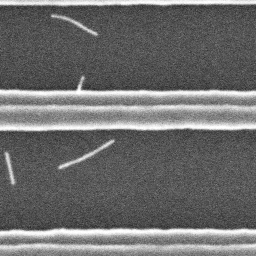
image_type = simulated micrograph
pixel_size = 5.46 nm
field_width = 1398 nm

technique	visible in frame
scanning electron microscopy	lines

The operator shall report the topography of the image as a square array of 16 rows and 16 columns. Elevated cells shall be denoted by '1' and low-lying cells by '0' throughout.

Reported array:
0000000000000000
0000000000000000
0000000000000000
0000000000000000
0000000000000000
0000000000000000
1111111111111111
1111111111111111
0000000000000000
0000000000000000
0000000000000000
0000000000000000
0000000000000000
0000000000000000
1001111111111111
1111111111111111